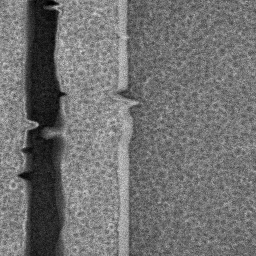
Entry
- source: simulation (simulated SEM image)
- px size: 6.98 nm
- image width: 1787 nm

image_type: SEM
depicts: one or a few lines or trenches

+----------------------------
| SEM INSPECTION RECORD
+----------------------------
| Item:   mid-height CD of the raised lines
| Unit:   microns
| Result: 0.44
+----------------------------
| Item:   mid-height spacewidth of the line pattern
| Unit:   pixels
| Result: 33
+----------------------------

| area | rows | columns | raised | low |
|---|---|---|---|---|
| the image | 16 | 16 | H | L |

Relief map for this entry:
HHLLHHHHLLLLLLLL
HHLLHHHHLLLLLLLL
HHLHHHHHLLLLLLLL
HHLHHHHHLLLLLLLL
HHLLHHHHLLLLLLLL
HHLLHHHLLLLLLLLL
HHLLHHHHLLLLLLLL
HHLLHHHHLLLLLLLL
HHLHHHHHLLLLLLLL
HHLLHHHHLLLLLLLL
HHLLHHHHLLLLLLLL
HHLLHHHHLLLLLLLL
HHLLHHHHLLLLLLLL
HHLLHHHHLLLLLLLL
HHLLHHHHLLLLLLLL
HHLLHHHHLLLLLLLL